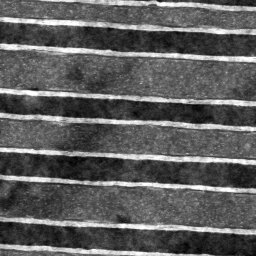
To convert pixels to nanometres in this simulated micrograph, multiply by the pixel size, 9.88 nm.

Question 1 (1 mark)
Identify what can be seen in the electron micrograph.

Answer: parallel lines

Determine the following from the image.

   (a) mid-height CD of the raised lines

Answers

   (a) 266 nm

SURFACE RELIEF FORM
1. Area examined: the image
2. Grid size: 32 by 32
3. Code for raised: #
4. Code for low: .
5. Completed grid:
....................############
................................
##..............................
###################.............
################################
################################
............####################
................................
................................
................................
................................
#...............................
####################............
################################
################################
......................##########
................................
................................
................................
###############.................
################################
################################
......##########################
.........................#######
................................
................................
................................
###.............................
#######################.........
################################
################################
..........######################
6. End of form